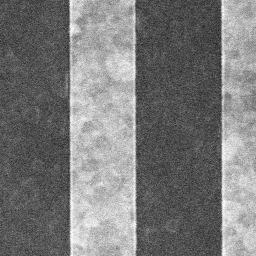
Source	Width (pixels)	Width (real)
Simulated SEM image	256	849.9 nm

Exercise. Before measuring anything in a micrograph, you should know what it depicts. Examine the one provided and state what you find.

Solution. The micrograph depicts one or a few lines or trenches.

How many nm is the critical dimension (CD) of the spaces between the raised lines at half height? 290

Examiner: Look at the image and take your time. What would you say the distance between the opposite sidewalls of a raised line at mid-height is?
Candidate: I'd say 212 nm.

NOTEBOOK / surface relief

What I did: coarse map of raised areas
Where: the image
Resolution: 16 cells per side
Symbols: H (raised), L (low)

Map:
LLLLHHHHLLLLLLHH
LLLLHHHHLLLLLLHH
LLLLHHHHLLLLLLHH
LLLLHHHHLLLLLLHH
LLLLHHHHLLLLLLHH
LLLLHHHHLLLLLLHH
LLLLHHHHLLLLLLHH
LLLLHHHHLLLLLLHH
LLLLHHHHLLLLLLHH
LLLLHHHHLLLLLLHH
LLLLHHHHLLLLLLHH
LLLLHHHHLLLLLLHH
LLLLHHHHLLLLLLHH
LLLLHHHHLLLLLLHH
LLLLHHHHLLLLLLHH
LLLLHHHHLLLLLLHH